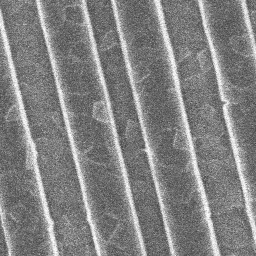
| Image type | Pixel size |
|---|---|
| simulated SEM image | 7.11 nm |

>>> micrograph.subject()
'one or a few lines or trenches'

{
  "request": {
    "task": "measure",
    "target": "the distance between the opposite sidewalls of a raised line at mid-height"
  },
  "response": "0.321 µm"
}